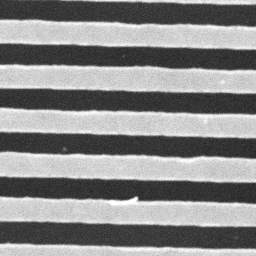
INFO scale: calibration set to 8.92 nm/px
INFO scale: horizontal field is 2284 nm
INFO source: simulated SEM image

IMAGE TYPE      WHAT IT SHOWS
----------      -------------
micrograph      lines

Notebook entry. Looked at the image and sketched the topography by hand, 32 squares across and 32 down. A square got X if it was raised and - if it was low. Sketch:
--------------------------------
--------------------------------
--------------------------------
XXXXXXXXXXXXXXXXXXXXXXXXXXXXXXXX
XXXXXXXXXXXXXXXXXXXXXXXXXXXXXXXX
---------XXXXXXXXXXXXXXXXXXXXXXX
--------------------------------
--------------------------------
XXXXXXXXXXXXXXXXXXXX------------
XXXXXXXXXXXXXXXXXXXXXXXXXXXXXXXX
XXXXXXXXXXXXXXXXXXXXXXXXXXXXXXXX
----------------------------XXXX
--------------------------------
--------------------------------
XXXXXXXXXXXXXXXXXXXXXXXXXXXXXXXX
XXXXXXXXXXXXXXXXXXXXXXXXXXXXXXXX
-----XXXXXXXXXXXXXXXXXXXXXXXXXXX
--------------------------------
--------------------------------
XXXXXXXXXXXXXXXXXX--------------
XXXXXXXXXXXXXXXXXXXXXXXXXXXXXXXX
XXXXXXXXXXXXXXXXXXXXXXXXXXXXXXXX
-----------------------XXXXXXXXX
--------------------------------
--------------------------------
XXXXXXXXXXXXXXXXXXXXXXXXXXXXXXX-
XXXXXXXXXXXXXXXXXXXXXXXXXXXXXXXX
XXXXXXXXXXXXXXXXXXXXXXXXXXXXXXXX
--------------------------------
--------------------------------
X-------------------------------
XXXXXXXXXXXXXXXXXXXXXXXXXXXXXXXX